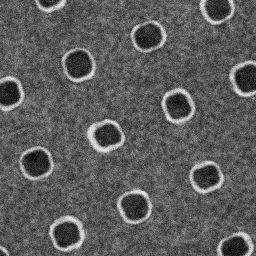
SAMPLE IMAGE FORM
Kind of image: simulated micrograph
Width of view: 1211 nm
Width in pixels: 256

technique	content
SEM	a regular array of raised bodies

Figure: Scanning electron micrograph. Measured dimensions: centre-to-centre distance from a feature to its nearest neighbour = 356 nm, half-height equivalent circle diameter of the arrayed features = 0.147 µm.